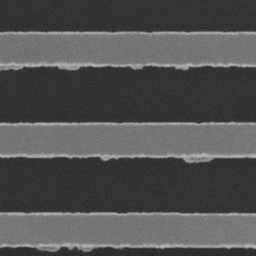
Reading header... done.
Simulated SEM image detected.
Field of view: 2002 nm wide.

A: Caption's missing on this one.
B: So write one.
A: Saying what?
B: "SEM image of lines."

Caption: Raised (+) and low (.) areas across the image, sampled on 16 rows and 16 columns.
................
................
++++++++++++++++
++++++++++++++++
................
................
................
................
++++++++++++++++
++++++++++++++++
................
................
................
++++++++++++++++
++++++++++++++++
..........+....+